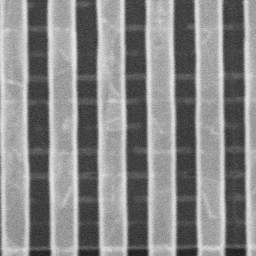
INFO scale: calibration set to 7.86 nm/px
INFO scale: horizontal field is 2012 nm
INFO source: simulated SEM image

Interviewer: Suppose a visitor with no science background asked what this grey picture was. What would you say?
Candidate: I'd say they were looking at wiring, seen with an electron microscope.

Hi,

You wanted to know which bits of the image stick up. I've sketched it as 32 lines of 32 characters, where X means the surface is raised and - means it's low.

XXX---XXX---XXX----XX----XXX---X
XXX---XXX---XXX----XX----XXX---X
XXX---XXX---XXX----XX----XXX---X
XXX---XXX---XXX---XXX----XXX---X
XXX---XXX----XX---XXX----XXX---X
XXX---XXX----XX---XXX----XXX---X
XXX---XXX----XX---XXXX---XXX---X
XXX---XXX---XXX----XXX---XXX---X
XXX---XXX---XXX----XXX---XXX---X
XXX---XXX---XXX----XXX---XXX---X
XXX---XXX---XXX----XXX---XXX---X
XXX---XXX---XXX----XXX---XXX---X
XXX---XXX---XXX----XXX---XXX---X
XXX---XXX---XXX----XXX---XXX---X
XXX---XXX---XXX----XXX---XXX---X
XXX---XXX----XX----XXX---XXX---X
XXX---XXX----XX----XXX---XXX---X
XXX----XX----XX----XXX---XXX---X
XXX---XXX----XX----XXX---XXX---X
XXX---XXX---XXX----XXX---XXX---X
XXX---XXX----XX----XXX---XXX---X
XXX---XXX----XX----XXX---XXX---X
XXX---XXX----XX----XXX---XXX---X
XXX---XXX----XX----XXX---XXX---X
XXX----XX----XX----XXX---XXX---X
XXX----XX----XXX---XXX---XXX---X
XXX----XX----XXX---XXX---XXX---X
XXX----XX----XXX---XXX---XXX---X
XXX----XX----XXX---XXX---XXX---X
XXX----XX----XXX---XXX---XXX---X
XXX----XX----XXX---XXX---XXX---X
XXX----XX----XXX---XXX---XXX---X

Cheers